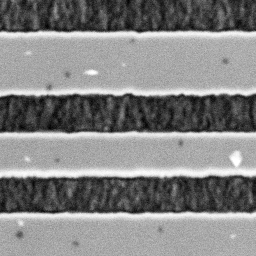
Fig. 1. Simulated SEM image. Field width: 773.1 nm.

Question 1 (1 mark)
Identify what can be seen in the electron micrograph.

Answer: lines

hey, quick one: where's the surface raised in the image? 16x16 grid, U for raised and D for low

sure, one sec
DDDDDDDDDDDDDDDD
DDDDDDDDDDDDDDDD
UUUUUUUUUUUUUUUU
UUUUUUUUUUUUUUUU
UUUUUUUUUUUUUUUU
UUUUUUUUUUUUUUUU
DDDDDDDDDDDDDDDD
DDDDDDDDDDDDDDDD
UUUUUUUUUUUUUUUU
UUUUUUUUUUUUUUUU
UUUUUUUUUUUUUUUU
DDDDDDDDDDDDDDDD
DDDDDDDDDDDDDDDD
UUUUUUUUUUUUUUUU
UUUUUUUUUUUUUUUU
UUUUUUUUUUUUUUUU